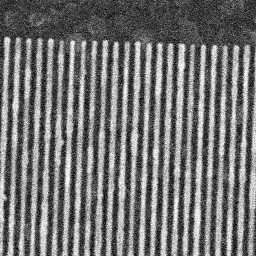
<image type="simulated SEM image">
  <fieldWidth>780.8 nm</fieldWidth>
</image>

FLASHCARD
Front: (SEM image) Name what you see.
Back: parallel lines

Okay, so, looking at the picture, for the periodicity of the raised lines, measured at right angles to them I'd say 33.3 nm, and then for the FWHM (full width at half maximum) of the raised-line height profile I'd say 13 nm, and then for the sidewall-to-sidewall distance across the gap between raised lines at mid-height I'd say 20.6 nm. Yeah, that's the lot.